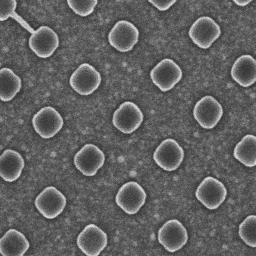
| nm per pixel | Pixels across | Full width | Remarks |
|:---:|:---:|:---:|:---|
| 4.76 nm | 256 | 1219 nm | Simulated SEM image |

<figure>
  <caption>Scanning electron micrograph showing a regular array of raised bodies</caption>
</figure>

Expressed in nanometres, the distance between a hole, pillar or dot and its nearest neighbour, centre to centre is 268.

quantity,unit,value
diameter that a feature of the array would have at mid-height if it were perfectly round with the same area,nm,139